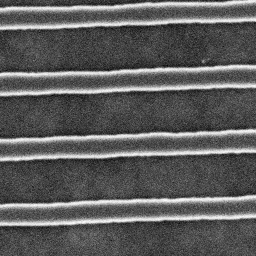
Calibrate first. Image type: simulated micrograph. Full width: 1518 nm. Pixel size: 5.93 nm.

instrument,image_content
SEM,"lines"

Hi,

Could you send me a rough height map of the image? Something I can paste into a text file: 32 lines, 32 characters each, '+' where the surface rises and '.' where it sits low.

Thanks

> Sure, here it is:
..................+.++++++++++++
++++++++++++++++++++++++++++++++
++++++++++++++++++++++++++++++++
++..............................
................................
................................
................................
................................
.........................+++++++
++++++++++++++++++++++++++++++++
++++++++++++++++++++++++++++++++
+++++++++++++...................
................................
................................
................................
................................
...........................+++++
++++++++++++++++++++++++++++++++
++++++++++++++++++++++++++++++++
+++++++++++++++.................
................................
................................
................................
................................
................................
......++++++++++++++++++++++++++
++++++++++++++++++++++++++++++++
+++++++++++++++++++++...........
................................
................................
................................
................................